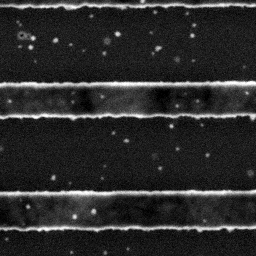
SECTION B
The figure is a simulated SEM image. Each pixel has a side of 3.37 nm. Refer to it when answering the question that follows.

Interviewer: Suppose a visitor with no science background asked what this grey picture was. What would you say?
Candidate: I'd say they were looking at lines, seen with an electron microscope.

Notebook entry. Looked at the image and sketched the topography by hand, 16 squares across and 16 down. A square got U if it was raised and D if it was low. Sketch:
DDDDDDDDDDDDDDDD
DDDDDDDDDDDDDDDD
DDDDDDDDDDDDDDDD
DDDDDDDDDDDDDDDD
DDDDDDDDDDDDDDDD
UUUUUUUUUUUUUUUU
UUUUUUUUUUUUUUUU
DDDDDDDDDDDDDDDD
DDDDDDDDDDDDDDDD
DDDDDDDDDDDDDDDD
DDDDDDDDDDDDDDDD
DDDDDDDDDDDDDDDD
UUUUUUUUUUUUUUUU
UUUUUUUUUUUUUUUU
DDDDDDDDDDDDDDDD
DDDDDDDDDDDDDDDD